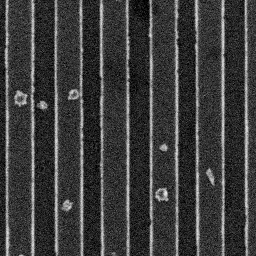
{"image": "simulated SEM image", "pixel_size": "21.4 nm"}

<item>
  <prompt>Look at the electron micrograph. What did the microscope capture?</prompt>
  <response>lines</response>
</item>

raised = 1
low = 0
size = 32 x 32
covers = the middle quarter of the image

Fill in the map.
11110000011111110000001111110000
11110000011111110000001111110000
11110000011111110000001111110000
11110000011111110000001111110000
11110000011111110000001111110000
11110000011111110000001111110000
11110000011111110000001111110000
11110000011111110000001111110000
11110000011111110000001111110000
11110000011111110000001111110000
11110000011111110000001111110000
11111000011111110000001111110000
11111000011111110000001111110000
11111000011111110000001111110000
11111000011111110000001111110000
11110000011111110000001111110000
11110000011111110000001111110000
11110000011111110000001111110000
11110000011111110000001111110000
11110000011111110000001111110000
11111000011111110000001111110000
11111000011111110000001111110000
11110000011111110000001111110000
11110000011111110000001111110000
11110000011111110000001111110000
11111000011111110000001111110000
11111000011111110000001111110000
11111000011111110000001111110000
11111000011111110000001111110000
11110000011111110000001111110000
11110000011111110000001111110000
11110000011111110000001111110000